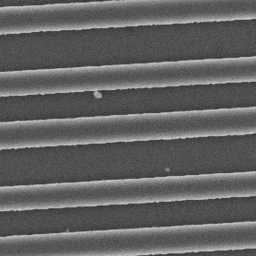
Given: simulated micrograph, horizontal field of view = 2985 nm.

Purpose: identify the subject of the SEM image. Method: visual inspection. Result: lines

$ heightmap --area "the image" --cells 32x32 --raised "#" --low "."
.........#######################
################################
##############################..
############....................
................................
................................
................................
.........................#######
.........#######################
################################
#########################.......
##########..#...................
................................
...............................#
..............##################
################################
################################
###################.............
##..............................
................................
................................
...............................#
................################
################################
###############################.
##############..................
................................
................................
....................############
..##############################
################################
########################........